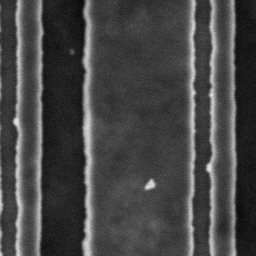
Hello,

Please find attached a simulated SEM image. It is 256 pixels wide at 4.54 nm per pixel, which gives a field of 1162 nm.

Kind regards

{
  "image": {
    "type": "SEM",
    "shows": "lines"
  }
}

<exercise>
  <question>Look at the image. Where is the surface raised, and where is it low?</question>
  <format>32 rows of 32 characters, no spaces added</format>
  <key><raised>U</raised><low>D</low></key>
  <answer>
UUUUUDDDDDDUUUUUUUUUUUUUUUUUUDDD
UUUUUDDDDDDUUUUUUUUUUUUUUUUUUDDD
UUUUUDDDDDDUUUUUUUUUUUUUUUUUUDDD
UUUUUDDDDDDUUUUUUUUUUUUUUUUUUDDD
UUUUUDDDDDDUUUUUUUUUUUUUUUUUUDDD
UUUUUDDDDDDUUUUUUUUUUUUUUUUUUDDD
UUUUUDDDDDDUUUUUUUUUUUUUUUUUUDDD
UUUUUDDDDDDUUUUUUUUUUUUUUUUUUDDD
UUUUUDDDDDDUUUUUUUUUUUUUUUUUUDDD
UUUUUDDDDDDUUUUUUUUUUUUUUUUUUDDD
UUUUUDDDDDDUUUUUUUUUUUUUUUUUUDDD
UUUUUDDDDDDUUUUUUUUUUUUUUUUUUDDD
UUUUUDDDDDDUUUUUUUUUUUUUUUUUUDDD
UUUUUDDDDDDUUUUUUUUUUUUUUUUUUDDD
UUUUUDDDDDDUUUUUUUUUUUUUUUUUUDDD
UUUUUDDDDDDUUUUUUUUUUUUUUUUUUDDD
UUUUUDDDDDDUUUUUUUUUUUUUUUUUUDDD
UUUUUDDDDDDUUUUUUUUUUUUUUUUUUDDD
UUUUUDDDDDDUUUUUUUUUUUUUUUUUUDDD
UUUUUDDDDDDUUUUUUUUUUUUUUUUUUDDD
UUUUUDDDDDDUUUUUUUUUUUUUUUUUUDDD
UUUUUDDDDDDUUUUUUUUUUUUUUUUUUDDD
UUUUUDDDDDDUUUUUUUUUUUUUUUUUUDDD
UUUUUDDDDDDUUUUUUUUUUUUUUUUUUDDD
UUUUUDDDDDDUUUUUUUUUUUUUUUUUUDDD
UUUUUDDDDDDUUUUUUUUUUUUUUUUUUDDD
UUUUUDDDDDDUUUUUUUUUUUUUUUUUUDDD
UUUUUDDDDDDUUUUUUUUUUUUUUUUUUDDD
UUUUUDDDDDDUUUUUUUUUUUUUUUUUUDDD
UUUUUDDDDDDUUUUUUUUUUUUUUUUUUDDD
UUUUUDDDDDDUUUUUUUUUUUUUUUUUUDDD
UUUUUDDDDDDUUUUUUUUUUUUUUUUUUDDD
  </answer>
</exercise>